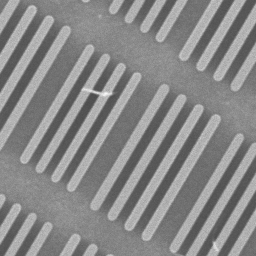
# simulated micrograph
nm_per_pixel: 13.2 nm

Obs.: groups of lines, slits or small figures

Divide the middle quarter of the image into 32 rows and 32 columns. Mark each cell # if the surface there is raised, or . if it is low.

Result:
...##...##...##.................
..###...##...##.................
..##...##...###...#.............
.##...###...##...##.............
###...##...##...###.............
##...##...###...##......##......
#...###...##...##.......##......
#...##...###..###......###......
...###...##...##......###...##..
...##...##...###......###...##..
..###...##...##......###...###..
.###...##...###......##....##...
.##...###..###......###...##....
###...##...##......###...###...#
##...##...###......##....##...##
#...###...##......###...###...##
#...##...##.......##...###...###
...###...##......###...###...##.
...##...##.......##...###...###.
..##...###......##....##...###..
.###...##......###...###...##...
.##...###......##....##...###...
###...##......###...###...##....
##...##......###...###...###...#
#...###......###...##....##...##
#...##......###...###...###...##
...###......##....##...###...###
...##......###...##....##...###.
..##.......##...###...###...###.
.###......###...##....##...###..
.##......###...###...###...##...
.##......##....##...###...###...